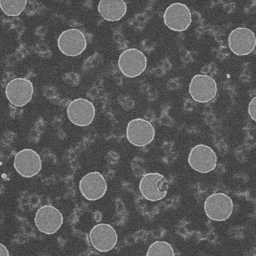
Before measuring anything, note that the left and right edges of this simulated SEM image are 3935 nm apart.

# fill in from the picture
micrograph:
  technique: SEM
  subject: a regular array of raised bodies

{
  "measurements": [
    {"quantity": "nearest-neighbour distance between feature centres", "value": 58.1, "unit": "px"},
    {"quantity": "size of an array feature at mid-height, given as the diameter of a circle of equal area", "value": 418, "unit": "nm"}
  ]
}